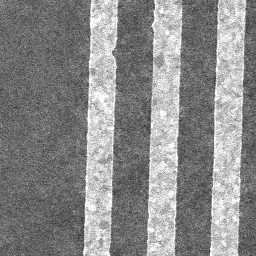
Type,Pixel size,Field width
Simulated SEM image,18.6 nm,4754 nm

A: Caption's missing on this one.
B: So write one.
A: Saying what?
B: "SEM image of parallel lines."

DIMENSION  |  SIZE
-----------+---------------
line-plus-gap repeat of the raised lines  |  1180 nanometers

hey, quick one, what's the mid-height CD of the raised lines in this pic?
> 0.494 µm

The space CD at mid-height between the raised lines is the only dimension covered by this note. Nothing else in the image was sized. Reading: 0.685 µm